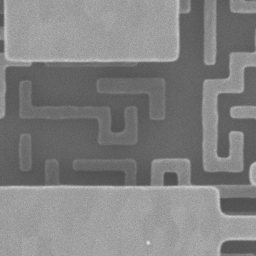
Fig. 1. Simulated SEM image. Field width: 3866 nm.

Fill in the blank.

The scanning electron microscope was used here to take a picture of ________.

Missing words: wiring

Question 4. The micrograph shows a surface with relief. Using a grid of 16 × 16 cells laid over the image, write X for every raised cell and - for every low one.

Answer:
XXXXXXXXXXX-----
XXXXXXXXXXX-----
XXXXXXXXXXX-----
XXXXXXXXXXX-----
----------------
----------------
----------------
----------------
----------------
----------------
----------------
----------------
XXXXXXXXXXXXXX--
XXXXXXXXXXXXXXX-
XXXXXXXXXXXXXXXX
XXXXXXXXXXXXXX--